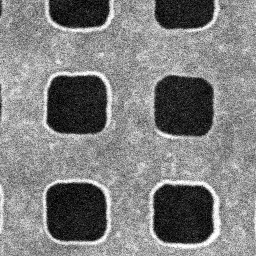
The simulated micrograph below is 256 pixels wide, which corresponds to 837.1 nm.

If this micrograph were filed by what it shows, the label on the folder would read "holes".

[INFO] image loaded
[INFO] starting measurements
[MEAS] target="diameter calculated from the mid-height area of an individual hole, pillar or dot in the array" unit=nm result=211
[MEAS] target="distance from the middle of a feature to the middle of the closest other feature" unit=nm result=350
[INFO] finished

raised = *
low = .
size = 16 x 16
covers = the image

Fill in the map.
***....***...***
****..****...***
****************
****************
****************
***....***...***
***....***...***
***....***...***
****************
****************
****************
****..**********
***....***...***
***....***...***
***....***...***
****************